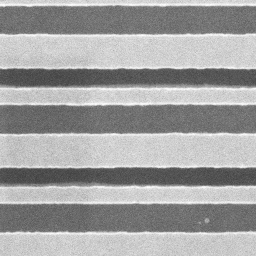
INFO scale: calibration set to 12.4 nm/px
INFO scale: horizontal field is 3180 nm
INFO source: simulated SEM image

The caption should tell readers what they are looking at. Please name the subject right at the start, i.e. lines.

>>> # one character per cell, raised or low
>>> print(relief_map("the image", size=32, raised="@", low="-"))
@@@@@@@@@@@@@@@@@@@@@@@@@@@@@@@@
--------------------------------
--------------------------------
--------------------------------
@@@@@@@@@@@@@@@@@@@@@@@@@@@@@@@@
@@@@@@@@@@@@@@@@@@@@@@@@@@@@@@@@
@@@@@@@@@@@@@@@@@@@@@@@@@@@@@@@@
@@@@@@@@@@@@@@@@@@@@@@@@@@@@@@@@
@-@@@@@@@@@@@@@@@@@@-@@-@@-@@@@@
--------------------------------
--------------------------------
@@@@@@@@@@@@@@@@@@@@@@@@@@@@@@@@
@@@@@@@@@@@@@@@@@@@@@@@@@@@@@@@@
--------------------------------
--------------------------------
--------------------------------
--------------------------------
@@@@@@@@@@@@@@@@@@@@@@@@@@@@@@@@
@@@@@@@@@@@@@@@@@@@@@@@@@@@@@@@@
@@@@@@@@@@@@@@@@@@@@@@@@@@@@@@@@
@@@@@@@@@@@@@@@@@@@@@@@@@@@@@@@@
--------------------------------
--------------------------------
@@@@@@@@@@@@@@@@@@@@@@@@@@@@@@@@
@@@@@@@@@@@@@@@@@@@@@@@@@@@@@@@@
--------------------------------
--------------------------------
--------------------------------
--------------------------------
@@@@@@@@@@@@@@@@@@@@@@@@@@@@@@@@
@@@@@@@@@@@@@@@@@@@@@@@@@@@@@@@@
@@@@@@@@@@@@@@@@@@@@@@@@@@@@@@@@